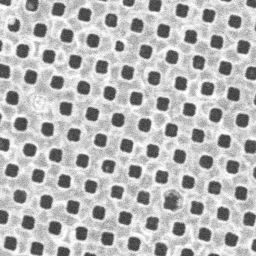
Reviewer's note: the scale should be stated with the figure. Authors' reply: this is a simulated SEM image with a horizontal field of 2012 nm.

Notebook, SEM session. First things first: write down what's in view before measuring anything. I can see a regular array of holes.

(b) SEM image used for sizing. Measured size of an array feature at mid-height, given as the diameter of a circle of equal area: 0.119 micrometres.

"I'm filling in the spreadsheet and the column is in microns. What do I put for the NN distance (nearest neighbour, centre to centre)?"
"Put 0.211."